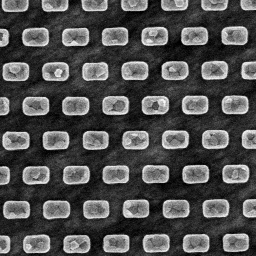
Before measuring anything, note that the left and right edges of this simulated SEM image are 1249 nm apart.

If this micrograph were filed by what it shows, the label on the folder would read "a regular array of raised bodies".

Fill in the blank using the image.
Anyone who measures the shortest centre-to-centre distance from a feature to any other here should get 193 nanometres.